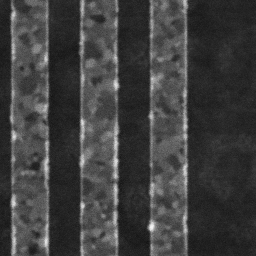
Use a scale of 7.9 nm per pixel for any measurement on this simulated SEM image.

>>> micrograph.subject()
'one or a few lines or trenches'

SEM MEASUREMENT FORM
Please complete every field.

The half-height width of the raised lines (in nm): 280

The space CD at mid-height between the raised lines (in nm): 262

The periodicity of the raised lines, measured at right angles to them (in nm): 548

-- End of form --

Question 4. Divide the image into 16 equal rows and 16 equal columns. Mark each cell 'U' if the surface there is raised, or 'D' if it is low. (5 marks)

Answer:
DUUDDUUDDUUUDDDD
DUUDDUUDDUUUDDDD
DUUDDUUDDUUUDDDD
DUUDDUUDDUUUDDDD
DUUDDUUDDUUUDDDD
DUUDDUUDDUUUDDDD
DUUDDUUDDUUUDDDD
DUUDDUUDDUUUDDDD
DUUDDUUDDUUUDDDD
DUUDDUUDDUUUDDDD
DUUDDUUDDUUUDDDD
DUUDDUUDDUUUDDDD
DUUDDUUDDUUUDDDD
DUUDDUUDDUUUDDDD
DUUDDUUDDUUUDDDD
DUUDDUUDDUUUDDDD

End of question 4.